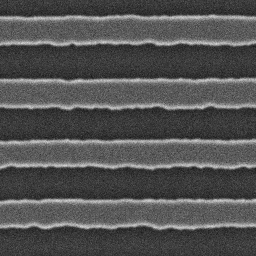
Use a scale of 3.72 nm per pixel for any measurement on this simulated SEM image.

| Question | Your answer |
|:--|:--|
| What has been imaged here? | lines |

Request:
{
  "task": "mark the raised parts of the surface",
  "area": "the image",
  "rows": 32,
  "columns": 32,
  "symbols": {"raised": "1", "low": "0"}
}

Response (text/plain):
00000000000000000000000000000000
00000000000000000000000000000000
11111111111111111111111111111111
11111111111111111111111111111111
11111111111111111111111111111111
11111011111100101101110011111111
00000000000000000000000000000000
00000000000000000000000000000000
00000000000000000000000000000000
00000000000000000000000000000000
11111111111111111111111111111111
11111111111111111111111111111111
11111111111111111111111111111111
00000000100101110000011110000000
00000000000000000000000000000000
00000000000000000000000000000000
00000000000000000000000000000000
00000000100000000000111110000001
11111111111111111111111111111111
11111111111111111111111111111111
11111111111111111111111111111111
00000000000000000000000000000000
00000000000000000000000000000000
00000000000000000000000000000000
00000000000000000000000000000000
11111111111111111111111111111111
11111111111111111111111111111111
11111111111111111111111111111111
00000100001001100001101110000000
00000000000000000000000000000000
00000000000000000000000000000000
00000000000000000000000000000000